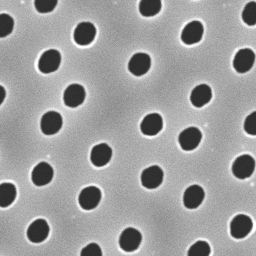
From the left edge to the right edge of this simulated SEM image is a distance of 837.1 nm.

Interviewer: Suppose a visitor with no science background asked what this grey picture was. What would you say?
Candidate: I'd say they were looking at a regular array of holes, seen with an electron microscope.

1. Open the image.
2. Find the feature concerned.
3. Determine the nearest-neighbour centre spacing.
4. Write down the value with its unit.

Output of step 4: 146 nm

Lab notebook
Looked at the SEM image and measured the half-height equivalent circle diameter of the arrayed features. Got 76.3 nm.